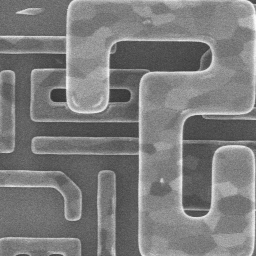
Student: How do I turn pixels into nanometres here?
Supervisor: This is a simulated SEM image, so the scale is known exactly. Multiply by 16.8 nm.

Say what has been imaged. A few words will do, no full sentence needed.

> wiring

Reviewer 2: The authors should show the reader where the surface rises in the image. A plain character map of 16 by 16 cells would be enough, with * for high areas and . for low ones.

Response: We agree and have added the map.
....************
....************
....************
....***......***
....***.....****
....***..*******
....***..*******
.........***....
.........**.....
.........**...**
.........**..***
.........**..***
.........**..***
.........***.***
.........*******
.........*******